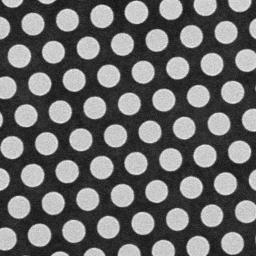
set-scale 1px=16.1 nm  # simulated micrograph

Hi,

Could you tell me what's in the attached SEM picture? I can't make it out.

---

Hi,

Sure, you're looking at an array of small figures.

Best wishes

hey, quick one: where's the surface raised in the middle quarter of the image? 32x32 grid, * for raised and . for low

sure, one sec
..........**......****....*****.
..**.....****....*****....*****.
*****...******...*****....*****.
*****....*****...*****.....**...
*****....****......**...........
*****.....**....................
.***....................**.....*
...............**......****....*
......***.....*****...******...*
.....*****....*****...******...*
*....*****....*****...*****.....
**...*****....*****.....**......
**...*****.....**...............
*......**....................**.
....................***.....****
...........***.....*****...*****
...**.....*****....*****...*****
..*****...******...*****....****
.******...******...*****.....**.
..*****....****.....***.........
..*****.....**..................
...**....................***....
................***.....*****...
........***.....****....*****...
**.....*****...******...*****...
***....*****...******...*****...
***....*****....****.....***....
****...*****.....**.............
***......*.....................*
**....................***....***
.............***.....*****...***
.....**.....*****...******...***